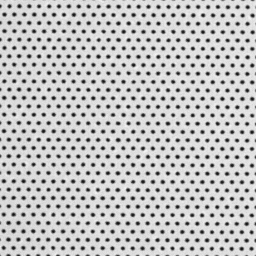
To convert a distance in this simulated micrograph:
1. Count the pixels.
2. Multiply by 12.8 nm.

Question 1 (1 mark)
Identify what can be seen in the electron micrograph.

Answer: a regular array of holes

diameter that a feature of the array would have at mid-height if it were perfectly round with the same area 61.5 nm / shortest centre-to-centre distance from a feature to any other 0.12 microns